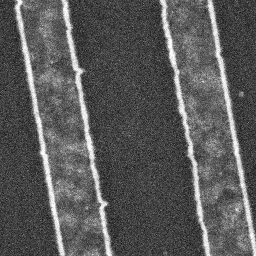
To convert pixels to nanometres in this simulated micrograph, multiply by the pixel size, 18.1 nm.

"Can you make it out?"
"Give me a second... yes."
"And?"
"one or a few lines or trenches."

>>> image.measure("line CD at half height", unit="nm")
854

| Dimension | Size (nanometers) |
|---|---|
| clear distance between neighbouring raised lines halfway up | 1760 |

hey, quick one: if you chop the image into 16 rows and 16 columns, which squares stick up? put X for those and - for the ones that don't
-XXX------XXX---
-XXX------XXX---
-XXX-------XXX--
--XXX------XXX--
--XXX------XXX--
--XXX------XXX--
--XXX------XXX--
--XXX-------XX--
---XXX------XXX-
---XXX------XXX-
---XXX------XXX-
---XXX------XXX-
---XXX------XXX-
---XXX-------XXX
----XXX------XXX
----XXX------XXX